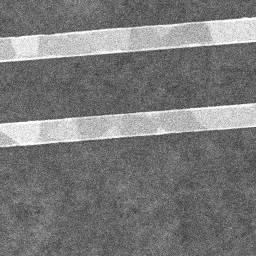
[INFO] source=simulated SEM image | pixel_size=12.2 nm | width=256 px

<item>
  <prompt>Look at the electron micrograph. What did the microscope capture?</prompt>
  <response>one or a few lines or trenches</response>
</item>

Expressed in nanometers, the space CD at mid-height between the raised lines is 769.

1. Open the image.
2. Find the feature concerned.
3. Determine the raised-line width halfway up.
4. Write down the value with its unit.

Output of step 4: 270 nanometers